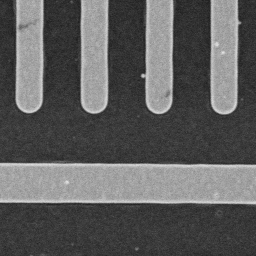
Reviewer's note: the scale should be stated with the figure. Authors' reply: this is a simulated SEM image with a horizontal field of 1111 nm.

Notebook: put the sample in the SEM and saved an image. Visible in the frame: groups of lines, slits or small figures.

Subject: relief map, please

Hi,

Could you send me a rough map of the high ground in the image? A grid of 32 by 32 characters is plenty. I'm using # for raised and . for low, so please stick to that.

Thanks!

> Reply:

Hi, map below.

..###.....###.....####....####..
..###.....###.....####....####..
..###.....###.....####....####..
..###.....###.....####....####..
..###.....###.....####....####..
..###.....###.....####....####..
..###.....###.....####....####..
..###.....###.....####....####..
..###.....###.....####....####..
..###.....###.....####....####..
..###.....###.....####....####..
..###.....###.....####....####..
..###.....###.....###.....####..
..###.....###......##......##...
................................
................................
................................
................................
................................
................................
##############..................
################################
################################
################################
################################
................................
................................
................................
................................
................................
................................
................................